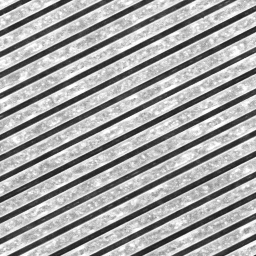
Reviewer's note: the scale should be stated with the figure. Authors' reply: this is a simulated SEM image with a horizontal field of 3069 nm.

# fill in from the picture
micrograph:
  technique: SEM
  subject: parallel lines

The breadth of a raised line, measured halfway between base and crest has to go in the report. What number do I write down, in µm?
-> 0.159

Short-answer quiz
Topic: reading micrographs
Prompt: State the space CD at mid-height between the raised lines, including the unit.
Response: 68.2 nm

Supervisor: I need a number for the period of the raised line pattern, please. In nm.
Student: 222